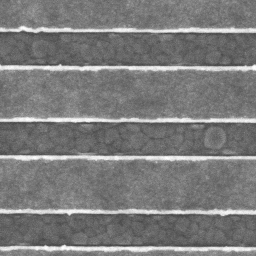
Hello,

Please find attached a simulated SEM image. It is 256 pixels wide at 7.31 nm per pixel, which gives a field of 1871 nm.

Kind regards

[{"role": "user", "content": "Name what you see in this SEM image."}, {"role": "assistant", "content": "one or a few lines or trenches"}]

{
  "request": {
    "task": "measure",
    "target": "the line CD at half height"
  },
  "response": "54.7 pixels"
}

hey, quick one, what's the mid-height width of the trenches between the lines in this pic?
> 266 nm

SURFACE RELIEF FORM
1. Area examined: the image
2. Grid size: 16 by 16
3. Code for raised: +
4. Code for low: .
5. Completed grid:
++++++++++++++++
++++++++++++++++
................
................
++++++++++++++++
++++++++++++++++
++++++++++++++++
++.+++++++++++++
................
................
++++++++++++++++
++++++++++++++++
++++++++++++++++
................
................
+++++.+++++.....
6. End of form